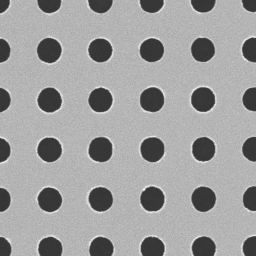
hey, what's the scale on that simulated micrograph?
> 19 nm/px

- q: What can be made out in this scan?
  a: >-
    a regular array of holes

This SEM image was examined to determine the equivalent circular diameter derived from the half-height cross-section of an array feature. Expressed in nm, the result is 472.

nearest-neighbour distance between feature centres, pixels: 49.7